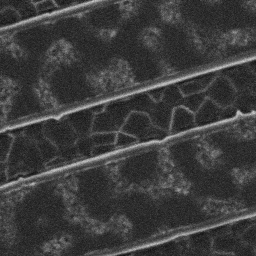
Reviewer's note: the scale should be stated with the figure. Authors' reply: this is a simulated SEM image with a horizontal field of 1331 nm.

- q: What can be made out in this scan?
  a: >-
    one or a few lines or trenches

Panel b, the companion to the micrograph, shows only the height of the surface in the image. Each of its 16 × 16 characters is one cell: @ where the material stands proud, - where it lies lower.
----@@@@@@@@@@@@
-@@@@@@@@@@@@@@@
@@@@@@@@@@@@@@@@
@@@@@@@@@@@@@@@@
@@@@@@@@@@@@@---
@@@@@@@@@-------
@@@@@@----------
@@@-----------@@
-----------@@@@@
-------@@@@@@@@@
----@@@@@@@@@@@@
-@@@@@@@@@@@@@@@
@@@@@@@@@@@@@@@@
@@@@@@@@@@@@@@@@
@@@@@@@@@@@@----
@@@@@@@@@-------